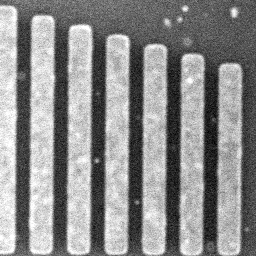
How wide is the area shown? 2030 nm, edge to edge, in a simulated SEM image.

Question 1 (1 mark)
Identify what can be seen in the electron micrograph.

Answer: groups of lines, slits or small figures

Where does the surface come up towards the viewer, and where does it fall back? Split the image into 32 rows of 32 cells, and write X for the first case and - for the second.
--------------------------------
XX------------------------------
XX--XX--------------------------
XX--XXX--XX---------------------
XX--XXX--XX---------------------
XX--XXX--XX--XXX----------------
XX--XXX--XX--XXX--XXX-----------
XX--XXX--XX--XXX--XXX--XX-------
XX--XXX--XX--XXX--XXX--XX---XX--
XX--XXX--XX--XXX--XXX--XX--XXX--
XX--XXX--XX--XXX--XXX--XX--XXX--
XX--XXX--XX--XXX--XXX--XX--XXX--
XX--XXX--XX--XXX--XXX--XX--XXX--
XX--XXX--XX--XXX--XXX--XX--XXX--
XX--XXX--XX--XXX--XXX--XX--XXX--
XX--XXX--XX--XXX--XXX--XX--XXX--
XX--XXX--XX--XXX--XXX--XX--XXX--
XX--XXX--XX--XXX--XXX--XX--XXX--
XX--XXX--XX--XXX--XXX--XX--XXX--
XX--XXX--XX--XXX--XXX--XX--XXX--
XX--XXX--XX--XXX--XXX--XX--XXX--
XX--XXX--XX--XXX--XXX--XX--XXX--
XX--XXX--XX--XXX--XXX--XX--XXX--
XX--XXX--XX--XXX--XXX--XX--XXX--
XX--XXX--XX--XXX--XXX--XX--XXX--
XX--XX---XX--XXX--XXX--XX--XXX--
XX--XX---XX--XXX--XXX--XX--XXX--
XX--XX---XX--XXX--XX---XX--XXX--
XX--XX---XX--XXX--XX---XX--XXX--
XX--XX---XX--XXX--XX---XX--XXX--
XX--XX---XX--XXX--XX---XX--XXX--
X---XX---XX---X---XX---XX---XX--